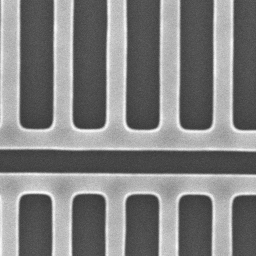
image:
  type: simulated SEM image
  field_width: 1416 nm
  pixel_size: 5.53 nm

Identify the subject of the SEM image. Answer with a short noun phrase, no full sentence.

groups of lines, slits or small figures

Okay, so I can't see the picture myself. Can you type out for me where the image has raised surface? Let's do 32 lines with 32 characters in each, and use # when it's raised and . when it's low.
##.....##.....##....##.....##...
##.....##.....##....##.....##...
##.....##.....##....##.....##...
##.....##.....##....##.....##...
##.....##.....##....##.....##...
##.....##.....##....##.....##...
##.....##....###....##.....##...
##.....##....###....##.....##...
##.....##....###....##.....##...
##.....##....###....##.....##...
##.....##....###....##.....##...
##.....##....###....##.....##...
##.....##....###....##.....##...
##.....##....###....##.....##...
##.....##....###....##.....##...
###....##....###....##.....##...
################################
################################
################################
................................
................................
................................
################################
################################
###...###....###...####...####..
##.....##....###....##.....##...
##.....##....###....##.....##...
##.....##....###....##.....##...
##.....##....###....##.....##...
##.....##....###....##.....##...
##.....##....###....##.....##...
##.....##....##.....##.....##...